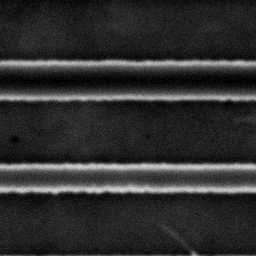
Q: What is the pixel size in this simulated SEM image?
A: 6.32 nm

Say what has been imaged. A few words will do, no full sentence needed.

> lines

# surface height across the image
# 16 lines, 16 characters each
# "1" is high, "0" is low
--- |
0000000000000000
0000000000000000
0000000000000000
0000000000000000
1111111111111111
1111111111111111
0000000000000000
0000000000000000
0000000000000000
0000000000000000
1111111111111111
1111111111111111
0000000000000000
0000000000000000
0000000000000000
0000000000000000